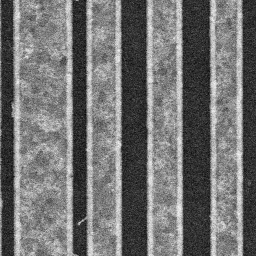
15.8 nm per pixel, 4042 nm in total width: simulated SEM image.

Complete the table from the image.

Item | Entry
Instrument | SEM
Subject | one or a few lines or trenches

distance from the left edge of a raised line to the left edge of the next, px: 61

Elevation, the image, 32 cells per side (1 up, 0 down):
00111111100111100001110000011100
00111111100111100001110000011100
00111111100111100001110000011100
00111111100111100001110000011100
00111111100111100001110000011100
00111111100111100001110000011100
00111111100111100001110000011100
00111111100111100001110000011100
00111111100111100001110000011100
00111111100111100001110000011100
00111111100111100001110000011100
00111111100111100001110000011100
00111111100111100001110000011100
00111111100111100001110000011100
00111111100111100001110000011100
00111111100111100001110000011100
00111111100111100001110000011100
00111111100111100001110000011100
00111111100111100001110000011100
00111111100111100001110000011100
00111111100111100001110000011100
00111111100111100001110000011100
00111111100111100001110000011100
00111111100111100001110000011100
00111111100111100001110000011100
00111111100111100001110000011100
00111111100111100001110000011100
00111111100111100001110000011100
00111111100111100001110000011100
00111111100111100001110000011100
00111111100111100001110000011100
00111111100111100001110000011100